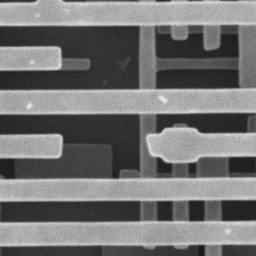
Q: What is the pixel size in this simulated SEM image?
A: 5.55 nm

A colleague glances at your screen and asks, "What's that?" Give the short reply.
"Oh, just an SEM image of wiring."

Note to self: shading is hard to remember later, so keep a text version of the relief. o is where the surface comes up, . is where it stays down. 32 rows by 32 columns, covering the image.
oooooooooooooooooooooooooooooooo
oooooooooooooooooooooooooooooooo
oooooooooooooooooooooooooooooooo
.................oo..oo..oo...oo
..................o...o...o...oo
..................o.......o...oo
oooooooo..........o...........oo
oooooooo..........o...........oo
ooooooo...........o...........oo
..................o...........oo
..................o...........oo
oooooooooooooooooooooooooooooooo
oooooooooooooooooooooooooooooooo
oooooooooooooooooooooooooooooooo
.................ooo............
..................o.............
..................ooooooo.......
oooooooo..........oooooooooooooo
oooooooo..........oooooooooooooo
ooooooo...........oooooooooooooo
..................o..ooooooo....
..................o...o..ooo....
oooooooooooooooooooooooooooooooo
oooooooooooooooooooooooooooooooo
oooooooooooooooooooooooooooooooo
..................oo..o...oo....
..................oo..o...oo....
.................ooo.ooo.ooo....
oooooooooooooooooooooooooooooooo
oooooooooooooooooooooooooooooooo
oooooooooooooooooooooooooooooooo
..........................oo....